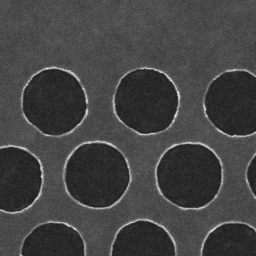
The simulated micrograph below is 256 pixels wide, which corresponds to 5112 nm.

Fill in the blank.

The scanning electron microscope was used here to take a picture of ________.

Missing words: holes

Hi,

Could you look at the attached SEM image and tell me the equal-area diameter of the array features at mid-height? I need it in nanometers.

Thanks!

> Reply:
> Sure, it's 1300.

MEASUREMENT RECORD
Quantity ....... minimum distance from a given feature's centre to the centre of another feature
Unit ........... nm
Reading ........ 1700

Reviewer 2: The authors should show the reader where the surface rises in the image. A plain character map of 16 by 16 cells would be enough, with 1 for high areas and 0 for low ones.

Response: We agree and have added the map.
1111111111111111
1111111111111111
1111111111111111
1111111111111111
1110111100111101
1100011000011000
1000011000011000
1100011100011000
1111111111111111
0011100111000111
0001000011000011
0001000011000011
0011100111100111
1111111111111111
1100011000111000
1000011000011000